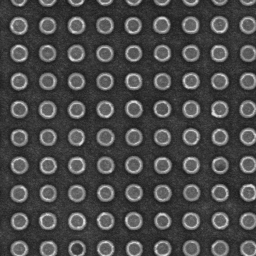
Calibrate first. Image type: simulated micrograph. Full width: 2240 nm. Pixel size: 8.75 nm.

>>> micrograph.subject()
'a regular array of raised bodies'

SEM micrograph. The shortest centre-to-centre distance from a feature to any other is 242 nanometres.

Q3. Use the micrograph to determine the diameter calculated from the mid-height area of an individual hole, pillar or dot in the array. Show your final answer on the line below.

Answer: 139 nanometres